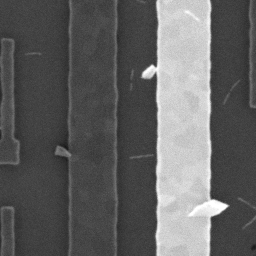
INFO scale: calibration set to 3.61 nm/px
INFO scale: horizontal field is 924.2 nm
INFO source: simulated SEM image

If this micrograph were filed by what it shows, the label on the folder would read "wiring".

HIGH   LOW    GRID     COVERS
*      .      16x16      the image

....***...***...
....***...***...
....***...***...
*...***...***...
*...***...***...
*...***...***...
*...***...***...
*...***...***...
*...***...***...
*...***...***...
....***...***...
....***...***...
....***...***...
*...***...***...
*...***...***...
*...***...***...